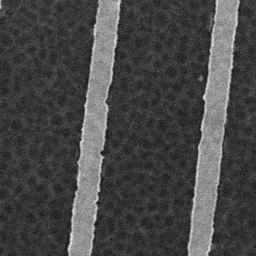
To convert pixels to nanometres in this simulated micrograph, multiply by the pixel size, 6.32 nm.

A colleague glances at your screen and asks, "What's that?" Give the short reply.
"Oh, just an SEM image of one or a few lines or trenches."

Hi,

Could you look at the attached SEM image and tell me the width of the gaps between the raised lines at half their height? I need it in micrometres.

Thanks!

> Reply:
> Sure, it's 0.609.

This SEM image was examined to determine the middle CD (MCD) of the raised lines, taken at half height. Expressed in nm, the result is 137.